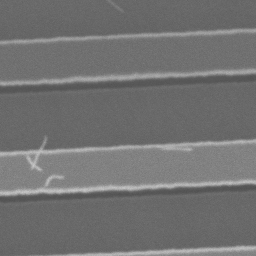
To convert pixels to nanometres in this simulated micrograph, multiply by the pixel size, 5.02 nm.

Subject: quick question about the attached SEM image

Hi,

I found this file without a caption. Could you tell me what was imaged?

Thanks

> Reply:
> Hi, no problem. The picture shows lines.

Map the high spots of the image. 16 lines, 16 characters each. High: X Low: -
----------------
----------------
--XXXXXXXXXXXXXX
XXXXXXXXXXXXXXXX
XXXXXXXXXXXXXXXX
----------------
----------------
----------------
----------------
XXXXXXXXXXXXXXXX
XXXXXXXXXXXXXXXX
XXXXXXXXXXXXXXXX
----------------
----------------
----------------
--------------XX